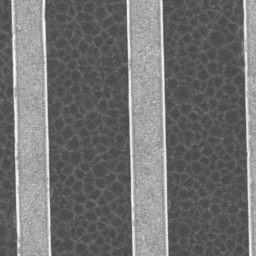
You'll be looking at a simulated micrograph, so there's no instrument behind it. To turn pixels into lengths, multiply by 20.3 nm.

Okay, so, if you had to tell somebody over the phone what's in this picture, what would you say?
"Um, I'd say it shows one or a few lines or trenches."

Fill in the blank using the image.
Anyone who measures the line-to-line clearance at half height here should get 1690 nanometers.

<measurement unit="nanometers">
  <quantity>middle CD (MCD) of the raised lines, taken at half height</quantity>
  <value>674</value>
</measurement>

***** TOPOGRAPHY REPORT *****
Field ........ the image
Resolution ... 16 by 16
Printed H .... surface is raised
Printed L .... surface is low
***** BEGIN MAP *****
LHHLLLLLHHLLLLLH
LHHLLLLLHHLLLLLH
LHHLLLLLHHLLLLLH
LHHLLLLLHHLLLLLH
LHHLLLLLHHLLLLLH
LHHLLLLLHHLLLLLH
LHHLLLLLHHLLLLLH
LHHLLLLLHHLLLLLH
LHHLLLLLHHLLLLLL
LHHLLLLLHHLLLLLL
LHHLLLLLHHLLLLLL
LHHLLLLLHHLLLLLL
LHHLLLLLHHLLLLLL
LHHLLLLLHHLLLLLL
LHHLLLLLHHLLLLLL
LHHLLLLLHHLLLLLL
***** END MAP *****